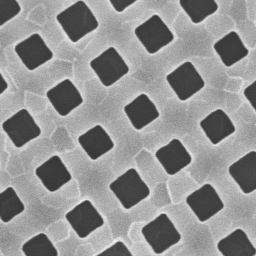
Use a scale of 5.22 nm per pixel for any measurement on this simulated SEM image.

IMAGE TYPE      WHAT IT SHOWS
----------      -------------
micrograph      a regular array of holes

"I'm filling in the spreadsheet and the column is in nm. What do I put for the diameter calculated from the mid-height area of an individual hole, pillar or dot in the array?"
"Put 174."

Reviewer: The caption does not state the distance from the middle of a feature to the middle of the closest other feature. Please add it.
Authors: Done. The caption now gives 0.282 micrometres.